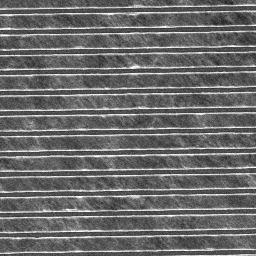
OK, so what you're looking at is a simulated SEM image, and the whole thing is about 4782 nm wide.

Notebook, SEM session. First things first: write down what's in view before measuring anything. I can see parallel lines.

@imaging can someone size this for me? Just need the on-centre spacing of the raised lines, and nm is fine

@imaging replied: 379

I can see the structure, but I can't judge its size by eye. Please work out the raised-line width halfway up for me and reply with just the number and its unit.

15.1 px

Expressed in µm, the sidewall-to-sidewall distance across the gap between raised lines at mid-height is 0.091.